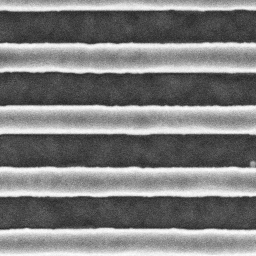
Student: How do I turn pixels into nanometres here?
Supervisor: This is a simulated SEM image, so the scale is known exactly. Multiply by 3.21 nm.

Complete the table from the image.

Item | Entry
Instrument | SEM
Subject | lines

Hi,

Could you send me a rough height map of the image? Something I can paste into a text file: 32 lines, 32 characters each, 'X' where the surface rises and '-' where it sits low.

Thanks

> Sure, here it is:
XXXXXXXXXXXXXXXXXXXXXXXXXXXXXXXX
--------------------------------
--------------------------------
--------------------------------
--------------------------------
XX-XXXXXXXX-XXXXXXX-XX-XXXXXXXXX
XXXXXXXXXXXXXXXXXXXXXXXXXXXXXXXX
XXXXXXXXXXXXXXXXXXXXXXXXXXXXXXXX
XXXXXXXXXXXXXXXXXXXXXXXXXXXXXXXX
--------------------------------
--------------------------------
--------------------------------
--------------------------------
XXXXXXXXXXXXXXXXXXXXXXXXXXXXXXXX
XXXXXXXXXXXXXXXXXXXXXXXXXXXXXXXX
XXXXXXXXXXXXXXXXXXXXXXXXXXXXXXXX
XXXXXXXXXXXXXXXXXXXXXXXXXXXXXXXX
--------------------------------
--------------------------------
--------------------------------
--------------------------------
XXXXXXXXXXXXXXXXXXXXXXXXXXXXXXXX
XXXXXXXXXXXXXXXXXXXXXXXXXXXXXXXX
XXXXXXXXXXXXXXXXXXXXXXXXXXXXXXXX
------XXXX-XXX----X------------X
--------------------------------
--------------------------------
--------------------------------
--------------------------------
XXXXXXXXXXXXXXXXXXXXXXXXXXXXXXXX
XXXXXXXXXXXXXXXXXXXXXXXXXXXXXXXX
XXXXXXXXXXXXXXXXXXXXXXXXXXXXXXXX